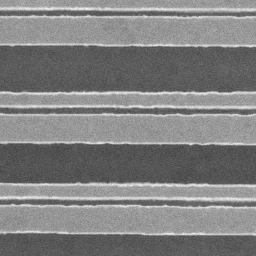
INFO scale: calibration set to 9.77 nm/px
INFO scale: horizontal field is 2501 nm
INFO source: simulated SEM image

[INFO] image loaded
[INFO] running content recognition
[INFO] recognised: lines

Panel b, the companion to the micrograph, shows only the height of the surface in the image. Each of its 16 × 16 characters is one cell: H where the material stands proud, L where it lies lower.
HHHHHHHHHHHHHHHH
HHHHHHHHHHHHHHHH
HHHHHHHHHHHHHHHH
LLLLLLLLLLLLLLLL
LLLLLLLLLLLLLLLL
LLLLLLLLLLLLLLLL
HHHHHHHHHHHHHHHH
HHHHHHHHHHHHHHHH
HHHHHHHHHHHHHHHH
LLLLLLLLLLLLLLLL
LLLLLLLLLLLLLLLL
HHHHHHHLLLLLLLLL
HHHHHHHHHHHHHHHH
HHHHHHHHHHHHHHHH
HHHHHHHHHHHHHHHH
LLLLLLLLLLLLLLLL